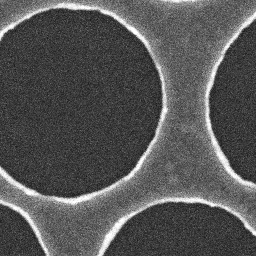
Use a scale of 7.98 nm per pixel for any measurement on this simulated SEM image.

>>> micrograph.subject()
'holes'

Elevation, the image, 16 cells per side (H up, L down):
HHHLLHHHHHHHHHHH
HLLLLLLLHHHHHHHH
LLLLLLLLLHHHHHHL
LLLLLLLLLHHHHHLL
LLLLLLLLLLHHHHLL
LLLLLLLLLLHHHLLL
LLLLLLLLLLHHHLLL
LLLLLLLLLLHHHLLL
LLLLLLLLLLHHHLLL
LLLLLLLLLHHHHHLL
LLLLLLLLHHHHHHLL
HLLLLLLHHHHHHHHH
HHHHHHHHHHHHHHHH
LHHHHHHHLLLLLLLH
LLHHHHHLLLLLLLLL
LLLHHHHLLLLLLLLL